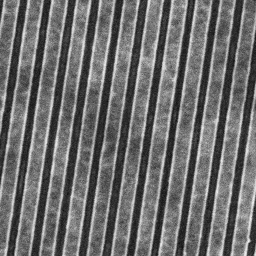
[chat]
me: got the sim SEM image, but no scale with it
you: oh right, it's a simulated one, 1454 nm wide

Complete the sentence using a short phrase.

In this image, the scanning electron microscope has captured parallel lines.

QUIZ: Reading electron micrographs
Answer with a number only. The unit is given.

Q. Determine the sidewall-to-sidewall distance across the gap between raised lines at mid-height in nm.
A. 52.7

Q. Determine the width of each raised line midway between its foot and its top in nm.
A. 83.6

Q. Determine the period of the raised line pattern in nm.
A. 135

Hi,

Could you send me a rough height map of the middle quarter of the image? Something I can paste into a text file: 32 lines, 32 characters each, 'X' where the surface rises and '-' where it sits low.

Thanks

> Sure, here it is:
-XXX---XXX---XXX---XXX---XXX---X
-XXX---XXX---XXX---XXX---XXX---X
-XXX---XXX--XXXX---XXX---XXX--XX
XXXX--XXXX--XXXX--XXXX--XXXX--XX
XXXX--XXXX--XXXX--XXXX--XXXX--XX
XXX---XXXX--XXXX--XXXX--XXXX--XX
XXX---XXX---XXX---XXX---XXXX--XX
XXX---XXX---XXX---XXX---XXX---XX
XXX---XXX---XXX---XXX---XXX---XX
XXX--XXXX--XXXX---XXX---XXX--XXX
XXX--XXXX--XXXX--XXXX--XXXX--XXX
XXX--XXXX--XXXX--XXXX--XXXX--XXX
XX---XXXX--XXX---XXX---XXXX--XXX
XX---XXX---XXX---XXX---XXX---XXX
XX---XXX---XXX---XXX---XXX---XXX
XX---XXX---XXX---XXX--XXXX--XXXX
XX--XXXX--XXXX--XXXX--XXXX--XXXX
XX--XXXX--XXXX--XXXX--XXXX--XXXX
XX--XXXX--XXXX--XXXX--XXXX--XXXX
X---XXX---XXX---XXXX--XXXX--XXXX
X---XXX---XXX---XXXX--XXXX--XXX-
X---XXX---XXX---XXX---XXX---XXX-
X---XXX---XXX---XXX---XXX---XXX-
X---XXX--XXXX--XXXX---XXX--XXXX-
X--XXXX--XXXX--XXXX--XXXX--XXXX-
X--XXXX--XXXX--XXXX--XXXX--XXXX-
---XXX---XXX---XXXX--XXX---XXXX-
---XXX---XXX---XXX---XXX---XXXX-
---XXX---XXX---XXX---XXX---XXX--
--XXXX---XXX---XXX---XXX--XXXX--
--XXXX--XXXX--XXXX---XXX--XXXX--
--XXXX--XXXX--XXXX--XXXX--XXXX--